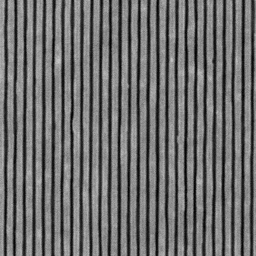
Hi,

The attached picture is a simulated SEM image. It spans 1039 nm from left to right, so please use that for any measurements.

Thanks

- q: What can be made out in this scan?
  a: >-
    parallel lines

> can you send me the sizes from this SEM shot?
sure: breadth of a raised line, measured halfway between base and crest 22.8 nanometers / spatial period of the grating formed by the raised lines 38.5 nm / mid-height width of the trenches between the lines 0.0152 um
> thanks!